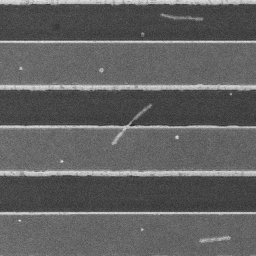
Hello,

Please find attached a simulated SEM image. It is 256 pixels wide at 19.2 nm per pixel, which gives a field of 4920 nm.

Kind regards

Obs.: lines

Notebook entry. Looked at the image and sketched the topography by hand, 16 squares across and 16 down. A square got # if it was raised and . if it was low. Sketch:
................
................
................
################
################
.##..#...#.#..##
................
................
################
################
################
................
................
################
################
################